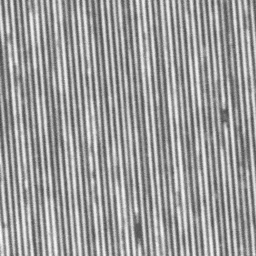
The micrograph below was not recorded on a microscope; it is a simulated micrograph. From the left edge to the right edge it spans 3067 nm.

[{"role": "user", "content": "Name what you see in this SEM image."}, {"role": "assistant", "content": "parallel lines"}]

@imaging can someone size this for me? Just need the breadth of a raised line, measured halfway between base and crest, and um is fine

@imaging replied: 0.012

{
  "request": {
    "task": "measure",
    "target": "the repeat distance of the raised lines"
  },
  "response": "71.6 nm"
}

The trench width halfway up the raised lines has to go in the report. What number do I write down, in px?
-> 4.74